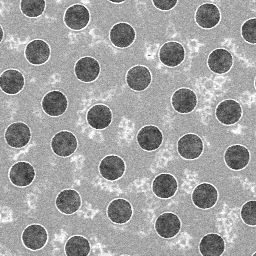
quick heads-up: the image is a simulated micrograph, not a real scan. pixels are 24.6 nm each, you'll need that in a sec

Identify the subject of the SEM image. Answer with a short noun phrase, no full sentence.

a regular array of holes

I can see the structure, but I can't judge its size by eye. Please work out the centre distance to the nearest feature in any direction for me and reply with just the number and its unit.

1090 nm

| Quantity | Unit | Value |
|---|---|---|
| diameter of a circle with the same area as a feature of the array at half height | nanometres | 632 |